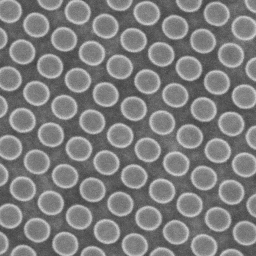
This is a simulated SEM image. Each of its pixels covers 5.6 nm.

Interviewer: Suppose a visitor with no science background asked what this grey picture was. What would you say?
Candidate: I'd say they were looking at a regular array of raised bodies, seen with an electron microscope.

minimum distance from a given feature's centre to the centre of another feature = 0.169 micrometres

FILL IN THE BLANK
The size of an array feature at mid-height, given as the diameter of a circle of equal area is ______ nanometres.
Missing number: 134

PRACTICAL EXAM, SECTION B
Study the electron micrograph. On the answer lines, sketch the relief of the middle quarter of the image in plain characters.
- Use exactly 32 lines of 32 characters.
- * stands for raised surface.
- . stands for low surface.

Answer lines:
...........******...........****
..***......******...........****
.*****......****...****......***
.*****.......**...******......**
.*****............******........
.*****..****......******..***...
..***...*****......****..*****..
........*****............******.
**......*****...**.......******.
***.....*****..*****......*****.
***...........******.......**...
***...........******............
***..****......*****..****......
*...******......***...*****.....
....******............*****.....
....******..****......*****...**
.....****..******.....*****..***
...........******...........****
..***......******...........****
.*****......*****..****......***
.******......***..******......**
.******...........******........
.******..***......******..***...
..****..*****......****..******.
........******...........******.
**......******...*.......******.
***......****..*****......*****.
***.......*....*****.......***..
***............******...........
***..****......*****..****......
**..******......***...*****.....
....******............*****.....